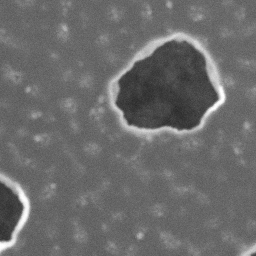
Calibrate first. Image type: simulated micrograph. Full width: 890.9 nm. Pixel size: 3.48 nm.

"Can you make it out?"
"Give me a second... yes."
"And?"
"holes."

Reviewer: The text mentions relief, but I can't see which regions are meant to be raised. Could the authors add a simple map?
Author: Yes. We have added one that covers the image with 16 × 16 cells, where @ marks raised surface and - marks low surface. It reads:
@@@@@@@@@@@@@@@@
@@@@@@@@@@@@@@@@
@@@@@@@@@@@@@@@@
@@@@@@@@@----@@@
@@@@@@@@-----@@@
@@@@@@@------@@@
@@@@@@@------@@@
@@@@@@@@-----@@@
@@@@@@@@@@@@@@@@
@@@@@@@@@@@@@@@@
@@@@@@@@@@@@@@@@
@@@@@@@@@@@@@@@@
-@@@@@@@@@@@@@@@
-@@@@@@@@@@@@@@@
-@@@@@@@@@@@@@@@
@@@@@@@@@@@@@@@@